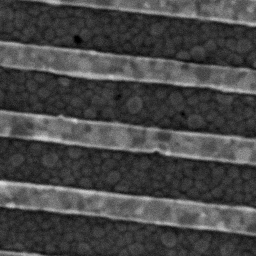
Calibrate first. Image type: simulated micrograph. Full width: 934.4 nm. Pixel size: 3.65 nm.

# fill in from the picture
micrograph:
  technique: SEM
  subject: one or a few lines or trenches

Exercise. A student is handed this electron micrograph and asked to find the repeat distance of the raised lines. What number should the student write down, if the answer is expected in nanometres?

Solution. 253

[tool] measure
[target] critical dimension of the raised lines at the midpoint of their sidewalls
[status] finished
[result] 85.2 nanometres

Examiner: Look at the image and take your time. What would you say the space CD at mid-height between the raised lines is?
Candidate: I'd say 167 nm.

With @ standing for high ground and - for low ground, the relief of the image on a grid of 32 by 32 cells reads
---------@@@@@@@@@@@@@@@@@@@@@@@
------------------@@@@@@@@@@@@@@
----------------------------@@@@
--------------------------------
--------------------------------
@@------------------------------
@@@@@@@@@@@---------------------
@@@@@@@@@@@@@@@@@@@@@-----------
--@@@@@@@@@@@@@@@@@@@@@@@@@@----
-----------@@@@@@@@@@@@@@@@@@@@@
----------------------@@@@@@@@@@
------------------------------@@
--------------------------------
--------------------------------
@@@@@---------------------------
@@@@@@@@@@@@@@------------------
@@@@@@@@@@@@@@@@@@@@@@----------
------@@@@@@@@@@@@@@@@@@@@@@@@@-
-------------@@@@@@@@@@@@@@@@@@@
-----------------------@@@@@@@@@
--------------------------------
--------------------------------
--------------------------------
@@@@@@@-------------------------
@@@@@@@@@@@@@@@@----------------
@@@@@@@@@@@@@@@@@@@@@@@@@-------
--------@@@@@@@@@@@@@@@@@@@@@@@@
-----------------@@@@@@@@@@@@@@@
-------------------------@@@@@@@
--------------------------------
--------------------------------
--------------------------------